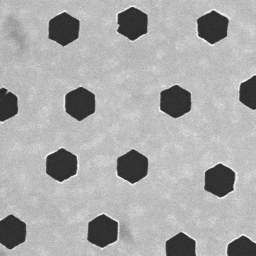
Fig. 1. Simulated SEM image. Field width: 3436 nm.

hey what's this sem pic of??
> a regular array of holes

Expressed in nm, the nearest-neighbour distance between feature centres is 948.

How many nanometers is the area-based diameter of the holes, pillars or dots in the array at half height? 429